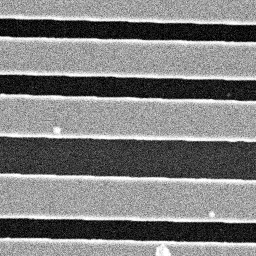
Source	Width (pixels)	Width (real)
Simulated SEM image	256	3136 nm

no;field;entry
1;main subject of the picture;lines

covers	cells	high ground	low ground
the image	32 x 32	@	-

@@@@@@@@@@@@@@@@@@@@@@@@@@@@@@@@
@@@@@@@@@@@@@@@@@@@@@@@@@@@@@@@@
-----------@@@@@@@@@@@@@@@@@@@@@
--------------------------------
--------------------------------
@@@@@@@@@@@@@@@@@@@@@@@@@@@@@@@@
@@@@@@@@@@@@@@@@@@@@@@@@@@@@@@@@
@@@@@@@@@@@@@@@@@@@@@@@@@@@@@@@@
@@@@@@@@@@@@@@@@@@@@@@@@@@@@@@@@
-------------@@@@@@@@@@@@@@@@@@@
--------------------------------
--------------------------------
@@@@@@@@@@@@@@@@@@@@@@@@@@@-----
@@@@@@@@@@@@@@@@@@@@@@@@@@@@@@@@
@@@@@@@@@@@@@@@@@@@@@@@@@@@@@@@@
@@@@@@@@@@@@@@@@@@@@@@@@@@@@@@@@
@@@@@@@@@@@@@@@@@@@@@@@@@@@@@@@@
-----------------------@@@@@@@@@
--------------------------------
--------------------------------
--------------------------------
--------------------------------
@@@@@@@@@@@@@@@@@@@@@@@@@@@@@@@-
@@@@@@@@@@@@@@@@@@@@@@@@@@@@@@@@
@@@@@@@@@@@@@@@@@@@@@@@@@@@@@@@@
@@@@@@@@@@@@@@@@@@@@@@@@@@@@@@@@
@@@@@@@@@@@@@@@@@@@@@@@@@@@@@@@@
----------------@@@@@@@@@@@@@@@@
--------------------------------
--------------------------------
@@@@@@@@@@@@@@@@@@@@@@@@@@@@@@@@
@@@@@@@@@@@@@@@@@@@@@@@@@@@@@@@@